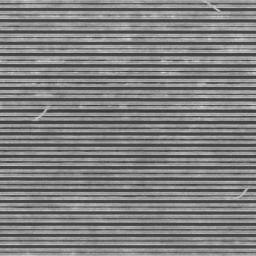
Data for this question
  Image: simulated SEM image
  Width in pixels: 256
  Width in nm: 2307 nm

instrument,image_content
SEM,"parallel lines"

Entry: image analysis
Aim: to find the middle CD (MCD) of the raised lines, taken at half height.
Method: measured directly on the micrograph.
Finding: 25.9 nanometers